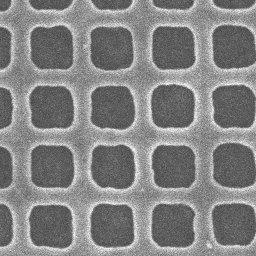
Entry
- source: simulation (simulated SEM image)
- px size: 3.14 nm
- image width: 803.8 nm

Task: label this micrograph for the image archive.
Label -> a regular array of holes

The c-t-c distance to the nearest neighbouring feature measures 0.185 microns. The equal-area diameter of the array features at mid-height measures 147 nanometers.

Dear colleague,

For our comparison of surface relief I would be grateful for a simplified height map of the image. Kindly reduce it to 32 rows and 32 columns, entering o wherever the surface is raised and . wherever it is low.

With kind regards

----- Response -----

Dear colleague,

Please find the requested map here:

.ooo.....ooo....ooo.....ooo.....
oooooooooooooooooooooooooooooooo
oooooooooooooooooooooooooooooooo
.ooo....oooo....oooo....ooo....o
.ooo.....oo.....ooo.....ooo.....
.ooo.....oo......oo.....ooo.....
.ooo.....oo......oo.....ooo.....
.ooo.....oo......oo.....ooo.....
ooooo....ooo....oooo....oooo..oo
oooooooooooooooooooooooooooooooo
oooooooooooooooooooooooooooooooo
.ooo.....ooo....ooo.....ooo.....
.ooo.....oo......oo.....ooo.....
..oo.....oo......oo.....ooo.....
.ooo.....oo......oo.....ooo.....
.ooo.....ooo.....oo.....ooo.....
oooooooooooooooooooooooooooooooo
oooooooooooooooooooooooooooooooo
.ooo.....ooo....oooo....ooo....o
.ooo.....oo......oo.....ooo.....
..oo.....oo......oo.....ooo.....
..oo.....oo......oo.....ooo.....
..oo.....ooo.....oo.....ooo.....
.ooooo..oooooo..ooooo..oooooo..o
oooooooooooooooooooooooooooooooo
oooooooooooooooooooo...ooooo...o
.ooo.....oo......oo.....oo......
..oo.....oo......oo.....oo......
..oo.....oo......oo.....ooo.....
..oo.....oo......oo.....ooo.....
.ooo.....ooo....oooo....ooo....o
oooooooooooooooooooooooooooooooo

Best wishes